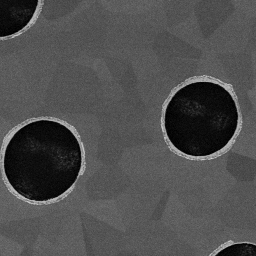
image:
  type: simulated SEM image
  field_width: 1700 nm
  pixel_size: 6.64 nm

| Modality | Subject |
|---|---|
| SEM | holes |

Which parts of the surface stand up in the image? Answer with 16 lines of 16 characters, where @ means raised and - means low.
--@@@@@@@@@@@@@@
--@@@@@@@@@@@@@@
@@@@@@@@@@@@@@@@
@@@@@@@@@@@@@@@@
@@@@@@@@@@@@@@@@
@@@@@@@@@@@---@@
@@@@@@@@@@@----@
@@@@@@@@@@-----@
@----@@@@@-----@
-----@@@@@@--@@@
-----@@@@@@@@@@@
@----@@@@@@@@@@@
@@-@@@@@@@@@@@@@
@@@@@@@@@@@@@@@@
@@@@@@@@@@@@@@@@
@@@@@@@@@@@@@@--